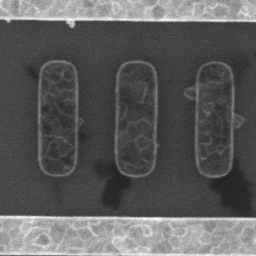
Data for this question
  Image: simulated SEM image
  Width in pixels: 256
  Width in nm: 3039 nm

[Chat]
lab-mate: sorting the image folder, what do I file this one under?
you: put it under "wiring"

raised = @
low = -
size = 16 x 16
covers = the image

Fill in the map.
@@@@@@@@@@@@@@@@
----------------
----------------
----------------
---@@--@@@--@@--
--@@@--@@@--@@@-
--@@@--@@@--@@@-
--@@@--@@@--@@@-
--@@@--@@@--@@--
--@@@--@@@--@@--
---@@--@@@--@@--
----------------
----------------
----------------
@@@@@@@@@@@@@@@@
@@@@@@@@@@@@@@@@